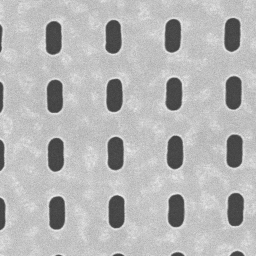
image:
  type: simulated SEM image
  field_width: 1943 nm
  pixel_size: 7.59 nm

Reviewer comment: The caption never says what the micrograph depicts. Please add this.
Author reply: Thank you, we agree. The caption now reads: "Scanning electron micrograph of a regular array of holes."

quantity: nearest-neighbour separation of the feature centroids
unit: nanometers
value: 442